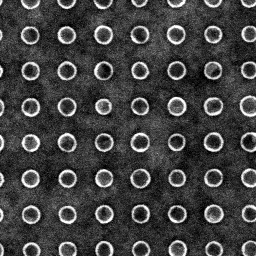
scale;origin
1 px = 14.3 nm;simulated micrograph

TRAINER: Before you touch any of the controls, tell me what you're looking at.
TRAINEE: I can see a regular array of raised bodies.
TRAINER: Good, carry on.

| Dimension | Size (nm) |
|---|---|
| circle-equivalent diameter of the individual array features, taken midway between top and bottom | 247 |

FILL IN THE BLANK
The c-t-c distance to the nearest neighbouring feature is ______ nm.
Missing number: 514